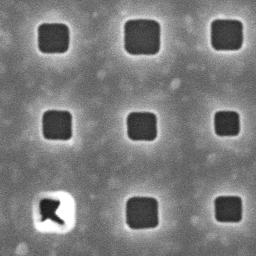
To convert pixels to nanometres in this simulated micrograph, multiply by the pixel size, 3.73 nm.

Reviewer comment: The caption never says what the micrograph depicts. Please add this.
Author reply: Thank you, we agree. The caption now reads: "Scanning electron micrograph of a regular array of holes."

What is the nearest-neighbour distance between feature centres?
85 px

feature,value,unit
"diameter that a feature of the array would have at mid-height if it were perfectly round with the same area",129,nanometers